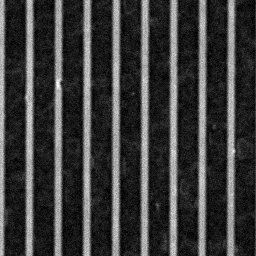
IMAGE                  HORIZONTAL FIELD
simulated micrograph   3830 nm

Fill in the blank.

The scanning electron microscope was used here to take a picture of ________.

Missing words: parallel lines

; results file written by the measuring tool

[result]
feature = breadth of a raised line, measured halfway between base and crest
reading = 89.8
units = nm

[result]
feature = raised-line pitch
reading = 0.431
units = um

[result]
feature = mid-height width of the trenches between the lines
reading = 344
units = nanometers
